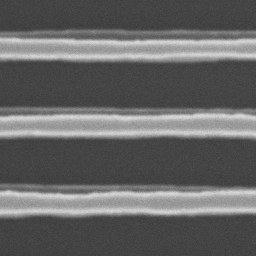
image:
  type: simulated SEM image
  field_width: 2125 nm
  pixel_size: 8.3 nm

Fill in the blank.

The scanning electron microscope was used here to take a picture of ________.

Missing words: lines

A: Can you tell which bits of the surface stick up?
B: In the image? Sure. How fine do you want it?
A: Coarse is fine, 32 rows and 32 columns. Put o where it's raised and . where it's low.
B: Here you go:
................................
................................
................................
................................
oooooooooooooooooooooooooooooooo
oooooooooooooooooooooooooooooooo
oooooooooooooooooooooooooooooooo
................................
................................
................................
................................
................................
................................
................................
oooooooooooooooooooooooooooooooo
oooooooooooooooooooooooooooooooo
oooooooooooooooooooooooooooooooo
................................
................................
................................
................................
................................
................................
oooooooooooooooooooooooooo......
oooooooooooooooooooooooooooooooo
oooooooooooooooooooooooooooooooo
oooooooooooooooooooooooooooo...o
................................
................................
................................
................................
................................